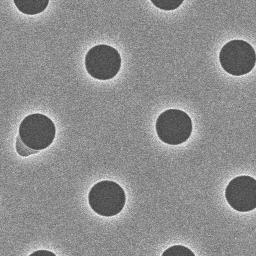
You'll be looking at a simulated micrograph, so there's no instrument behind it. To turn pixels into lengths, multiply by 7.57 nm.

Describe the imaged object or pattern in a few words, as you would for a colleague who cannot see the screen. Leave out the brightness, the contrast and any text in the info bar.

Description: holes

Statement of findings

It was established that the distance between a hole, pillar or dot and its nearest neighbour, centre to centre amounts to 724 nm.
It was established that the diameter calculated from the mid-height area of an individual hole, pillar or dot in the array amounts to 0.277 micrometres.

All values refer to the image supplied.